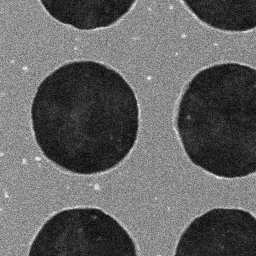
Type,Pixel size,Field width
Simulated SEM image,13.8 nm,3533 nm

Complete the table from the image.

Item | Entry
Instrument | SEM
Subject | holes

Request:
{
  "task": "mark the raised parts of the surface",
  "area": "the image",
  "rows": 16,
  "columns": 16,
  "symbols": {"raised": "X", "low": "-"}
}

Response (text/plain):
XXX-----XXXX----
XXXX---XXXXXX---
XXXXXXXXXXXXXXXX
XXXXXXXXXXXXXXXX
XXX----XXXXXX---
XX------XXXX----
XX-------XX-----
XX-------XX-----
XX------XXX-----
XXX-----XXXX----
XXXX---XXXXXX---
XXXXXXXXXXXXXXXX
XXXXXXXXXXXXXXXX
XXX----XXXXXX---
XX------XXX-----
XX------XXX-----